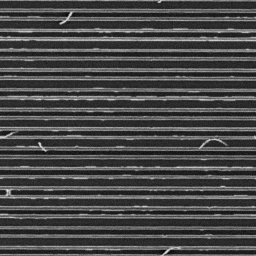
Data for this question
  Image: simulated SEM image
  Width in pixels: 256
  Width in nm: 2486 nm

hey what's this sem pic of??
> parallel lines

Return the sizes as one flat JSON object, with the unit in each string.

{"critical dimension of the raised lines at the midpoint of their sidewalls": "26.7 nm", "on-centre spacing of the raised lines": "96.1 nm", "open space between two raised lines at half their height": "63.1 nanometres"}